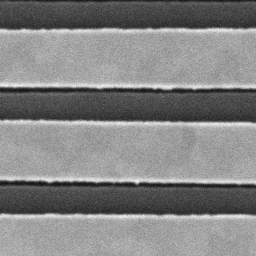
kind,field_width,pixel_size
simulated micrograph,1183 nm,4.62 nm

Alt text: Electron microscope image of lines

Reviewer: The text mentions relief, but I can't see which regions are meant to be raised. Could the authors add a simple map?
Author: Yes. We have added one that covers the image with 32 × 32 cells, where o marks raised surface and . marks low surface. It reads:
................................
................................
................................
................................
oooooooooooooooooooooooooooooooo
oooooooooooooooooooooooooooooooo
oooooooooooooooooooooooooooooooo
oooooooooooooooooooooooooooooooo
oooooooooooooooooooooooooooooooo
oooooooooooooooooooooooooooooooo
oooooooooooooooooooooooooooooooo
................................
................................
................................
................................
oooooooooooooooooooooooooooooooo
oooooooooooooooooooooooooooooooo
oooooooooooooooooooooooooooooooo
oooooooooooooooooooooooooooooooo
oooooooooooooooooooooooooooooooo
oooooooooooooooooooooooooooooooo
oooooooooooooooooooooooooooooooo
.o..oooooooooooooooooooooooooooo
................................
................................
................................
................................
oooooooooooooooooooooooooooooooo
oooooooooooooooooooooooooooooooo
oooooooooooooooooooooooooooooooo
oooooooooooooooooooooooooooooooo
oooooooooooooooooooooooooooooooo